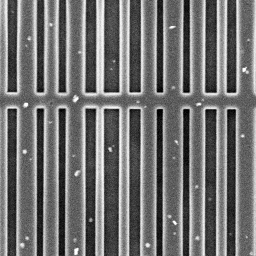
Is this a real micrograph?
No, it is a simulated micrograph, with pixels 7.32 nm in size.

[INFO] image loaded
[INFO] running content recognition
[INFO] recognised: groups of lines, slits or small figures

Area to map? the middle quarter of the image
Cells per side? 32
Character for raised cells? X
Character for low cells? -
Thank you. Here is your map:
-XXXX---XX----XX----XXX--XXXX---
-XXXX---XX----XX----XXX--XXXX---
-XXXX---XX----XX----XXX--XXXX---
-XXXX---XX----XX----XXX--XXXX---
-XXXX---XX----XX----XXX--XXXX---
-XXXX---XX----XX----XXX--XXXX---
-XXXX---XX----XX----XXX--XXXX---
XXXXXXXXXXXXXXXXXXXXXXXXXXXXXXXX
XXXXXXXXXXXXXXXXXXXXXXXXXXXXXXXX
XXXXXXXXXXXXXXXXXXXXXXXXXXXXXXXX
XXXXXXXXXXXXXXXXXXXXXXXXXXXXXXXX
-XXXX---XX----XX---XXXX--XXXXX-X
-XXXX---XX----XX---XXXX--XXXX---
-XXXX---XX----XX---XXXX--XXXXX--
-XXXX---XX----XX---XXXX--XXXXX-X
-XXXX---XX----XX---XXXX--XXXXX-X
-XXXX---XX----XX---XXXX--XXXXX-X
-XXXX---XX----XX---XXXX--XXXXX-X
-XXXX---XX----XX---XXXX--XXXXX-X
-XXXX---XX----XX----XXX--XXXXX-X
-XXXX---XX----XX----XXX--XXXXX-X
-XXXX---XX----XX----XXX--XXXXX-X
-XXXX---XX----XX---XXXX--XXXX--X
-XXXX---XX----XX---XXXX--XXXX--X
-XXXX---XX----XX---XXXX--XXXX--X
-XXXX---XX----XX---XXXX--XXXX--X
-XXXX---XX----XX---XXXX--XXXX--X
-XXXX---XX----XX---XXXX--XXXX--X
-XXXX---XX----XX---XXXX--XXXX--X
-XXXX---XX----XX---XXXX--XXXX--X
-XXXX---XX----XX---XXXX--XXXX--X
-XXXX---XX----XX---XXXX--XXXX--X